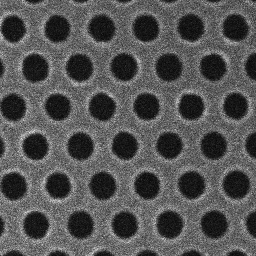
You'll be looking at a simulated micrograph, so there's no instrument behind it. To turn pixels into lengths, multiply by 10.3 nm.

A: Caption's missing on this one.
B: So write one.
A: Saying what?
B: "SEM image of a regular array of holes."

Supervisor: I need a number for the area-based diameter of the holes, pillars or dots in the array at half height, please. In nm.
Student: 293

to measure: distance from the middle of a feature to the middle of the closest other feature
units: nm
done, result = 457